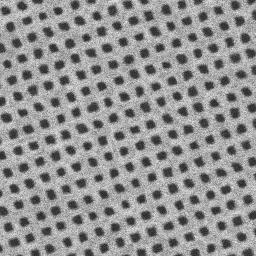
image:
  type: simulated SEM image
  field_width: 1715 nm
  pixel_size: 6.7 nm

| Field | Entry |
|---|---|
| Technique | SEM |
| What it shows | a regular array of holes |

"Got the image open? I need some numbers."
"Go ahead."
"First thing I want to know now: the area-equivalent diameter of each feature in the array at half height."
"60.4 nanometres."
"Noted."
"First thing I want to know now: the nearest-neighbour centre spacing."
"109 nm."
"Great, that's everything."